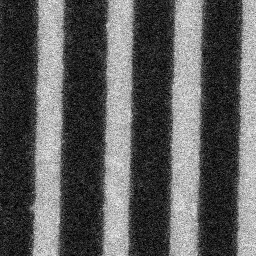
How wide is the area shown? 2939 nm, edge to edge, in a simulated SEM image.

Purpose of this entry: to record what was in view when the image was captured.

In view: one or a few lines or trenches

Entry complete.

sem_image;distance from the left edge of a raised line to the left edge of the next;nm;773